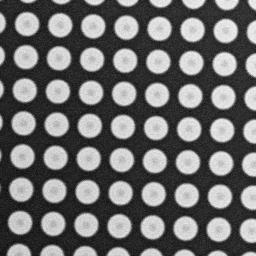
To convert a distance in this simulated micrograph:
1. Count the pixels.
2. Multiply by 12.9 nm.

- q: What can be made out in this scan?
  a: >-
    an array of small figures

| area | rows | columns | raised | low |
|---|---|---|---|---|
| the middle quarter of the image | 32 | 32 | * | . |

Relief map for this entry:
*....****....*****...*****...***
......**.....****.....****....**
...............................*
................................
......**........................
*...*****....****....****.....**
*...******..******...*****...***
*...******..******...*****...***
*...*****...******..******...***
.....****....****....*****...***
.......................*......**
................................
................................
....*****....****.....**........
*...*****...*****....****....***
*...*****...******..******...***
*...*****...*****...******..****
....****....*****....*****...***
..............**.....***.....***
................................
................................
....****.....***......*.........
*...*****...*****...*****....***
*..******...*****...*****...****
*..******...*****...******..****
....*****...*****...*****...****
.....**......***.....****....***
................................
................................
....***.......*.................
...*****....****....*****....***
...******..******...*****...****